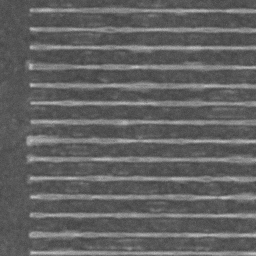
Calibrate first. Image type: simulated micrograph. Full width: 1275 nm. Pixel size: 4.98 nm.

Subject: parallel lines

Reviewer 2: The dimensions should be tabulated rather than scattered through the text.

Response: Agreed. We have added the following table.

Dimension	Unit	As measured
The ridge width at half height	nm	14.9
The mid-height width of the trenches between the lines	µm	0.0778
